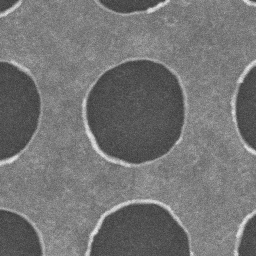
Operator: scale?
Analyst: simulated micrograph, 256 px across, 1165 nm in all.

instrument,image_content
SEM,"holes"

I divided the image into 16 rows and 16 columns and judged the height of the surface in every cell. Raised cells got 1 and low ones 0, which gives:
0111111001111111
1111111111111111
1111111111111111
1111111111111111
0011111000011111
0011110000011110
0001100000001110
0011100000001110
0011110000011110
0111110000111111
1111111111111111
1111111111111111
1111111111111111
0111111000011111
0011110000001110
0001110000001110